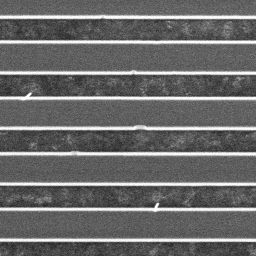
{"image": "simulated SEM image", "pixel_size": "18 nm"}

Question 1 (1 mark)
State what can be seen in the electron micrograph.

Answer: parallel lines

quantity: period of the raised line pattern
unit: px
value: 55.7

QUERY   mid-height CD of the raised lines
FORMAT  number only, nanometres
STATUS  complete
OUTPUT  554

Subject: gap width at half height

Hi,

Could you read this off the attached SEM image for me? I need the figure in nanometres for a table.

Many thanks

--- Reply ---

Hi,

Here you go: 441